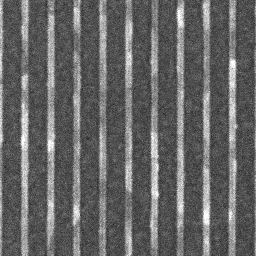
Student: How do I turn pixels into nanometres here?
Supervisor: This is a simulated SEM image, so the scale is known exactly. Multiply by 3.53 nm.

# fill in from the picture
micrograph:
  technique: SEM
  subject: parallel lines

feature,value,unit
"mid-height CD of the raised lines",18.1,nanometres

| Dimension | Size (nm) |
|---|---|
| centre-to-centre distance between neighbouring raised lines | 91.6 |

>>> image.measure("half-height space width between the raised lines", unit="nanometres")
72.3